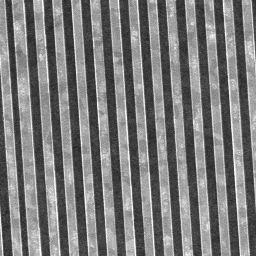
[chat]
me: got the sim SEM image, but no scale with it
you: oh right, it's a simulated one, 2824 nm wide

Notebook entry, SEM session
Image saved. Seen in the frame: parallel lines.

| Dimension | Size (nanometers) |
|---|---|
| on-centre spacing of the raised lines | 209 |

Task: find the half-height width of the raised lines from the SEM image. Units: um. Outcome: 0.0949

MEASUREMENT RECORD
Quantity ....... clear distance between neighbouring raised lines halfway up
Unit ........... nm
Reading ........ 114